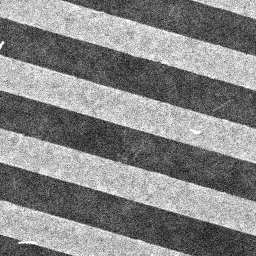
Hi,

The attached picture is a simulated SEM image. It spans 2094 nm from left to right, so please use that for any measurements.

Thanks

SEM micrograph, one or a few lines or trenches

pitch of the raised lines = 570 nm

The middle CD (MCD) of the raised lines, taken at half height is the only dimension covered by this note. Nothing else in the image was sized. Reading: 266 nm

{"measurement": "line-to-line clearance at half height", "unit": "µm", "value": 0.306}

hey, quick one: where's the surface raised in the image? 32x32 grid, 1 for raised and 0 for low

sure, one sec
11111111100000000000000000111111
11111111111100000000000000000111
01111111111111110000000000000000
00000111111111111110000000000000
00000000111111111111111000000000
00000000000011111111111111100000
00000000000000011111111111111100
11000000000000000001111111111111
11111000000000000000001111111111
11111111100000000000000000111111
11111111111100000000000000000111
01111111111111100000000000000000
00000111111111111110000000000000
00000000111111111111111000000000
00000000000111111111111111000000
00000000000000011111111111111100
11000000000000000011111111111111
11111000000000000000001111111111
11111111000000000000000001111111
11111111111100000000000000000111
01111111111111110000000000000000
00000111111111111110000000000000
00000000111111111111110000000000
00000000000011111111111111000000
00000000000000011111111111111000
11000000000000000011111111111111
11111000000000000000001111111111
11111111000000000000000001111111
11111111111100000000000000000111
01111111111111100000000000000000
00001111111111111110000000000000
00000000111111111111110000000000